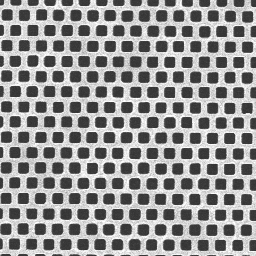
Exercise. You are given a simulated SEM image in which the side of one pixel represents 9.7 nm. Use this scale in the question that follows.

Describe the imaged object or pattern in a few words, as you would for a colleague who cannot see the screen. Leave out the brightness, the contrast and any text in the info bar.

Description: a regular array of holes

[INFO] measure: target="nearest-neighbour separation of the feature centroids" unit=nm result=165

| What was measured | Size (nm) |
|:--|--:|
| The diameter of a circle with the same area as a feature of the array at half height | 119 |